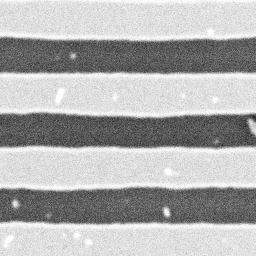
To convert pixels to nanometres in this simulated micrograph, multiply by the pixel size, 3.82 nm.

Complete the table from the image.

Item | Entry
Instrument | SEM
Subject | lines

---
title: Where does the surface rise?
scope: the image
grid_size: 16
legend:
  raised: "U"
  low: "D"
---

UUUUUUUUUUUUUUUU
UUUUUUUUUUUUUUUU
DDDDDDDDDDDDDDDD
DDDDDDDDDDDDDDDD
DDDDDDDDDDDDDDDD
UUUUUUUUUUUUUUUU
UUUUUUUUUUUUUUUU
DDDDDDDDDDDDDDDD
DDDDDDDDDDDDDDDD
UUUUUUUUUUUUUUUU
UUUUUUUUUUUUUUUU
UUUUUUUUUUUUUUUU
DDDDDDDDDDDDDDDD
DDDDDDDDDDDDDDDD
UUUUUUUUUUUUUUUU
UUUUUUUUUUUUUUUU